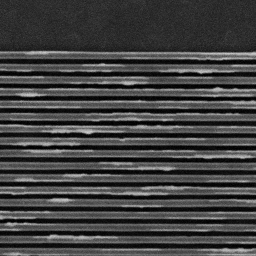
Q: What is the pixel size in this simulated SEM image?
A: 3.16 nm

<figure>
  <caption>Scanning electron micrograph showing parallel lines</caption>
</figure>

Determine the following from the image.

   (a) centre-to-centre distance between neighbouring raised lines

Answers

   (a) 38.8 nanometres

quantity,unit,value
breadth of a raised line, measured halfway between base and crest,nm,21.7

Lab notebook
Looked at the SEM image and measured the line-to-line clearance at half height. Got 16.6 nm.